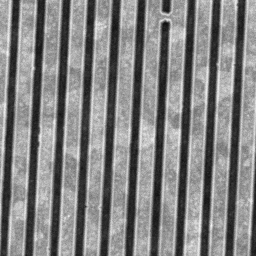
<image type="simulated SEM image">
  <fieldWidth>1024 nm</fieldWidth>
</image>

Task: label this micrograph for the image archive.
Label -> parallel lines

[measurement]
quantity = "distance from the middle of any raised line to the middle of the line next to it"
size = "100 nm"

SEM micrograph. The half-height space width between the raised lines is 46.4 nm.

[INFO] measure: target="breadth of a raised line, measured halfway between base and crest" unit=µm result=0.0539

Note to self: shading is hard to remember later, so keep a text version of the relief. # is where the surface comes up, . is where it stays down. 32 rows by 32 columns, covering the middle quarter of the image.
.###....###...###...###...####..
.###...####...###...###...####..
.###...####...###...###...####..
.###...####...###...###...####..
.###...###....###...###...###...
.###...###....###...###...###...
.###...###....###...###...###...
.###...###...####...###...###...
.###...###...####...###...###...
.###...###...####...###...###...
.###...###...####...###...###...
.###...###...####...###...###...
.###...###...####..####...###...
.###...###...####..####...###...
.###...###...###...####...###...
.###...###...###...####...###...
.###...###...###...####...###...
####...###...###...####..####...
####...###...###...####..####...
###....###...###...###...####...
###....###...###...###...####...
###....###...###...###...####...
###...####...###...###...####..#
###...####...###...###...####..#
###...###....###...###...###...#
###...###....###...###...###...#
###...###....###...###...###...#
###...###...####...###...###...#
###...###...####...###...###...#
###...###...####...###...###...#
###...###...####...###...###...#
###...###...####...###...###...#